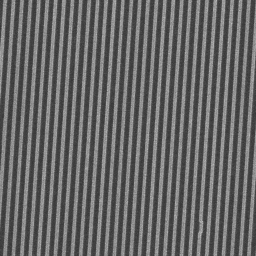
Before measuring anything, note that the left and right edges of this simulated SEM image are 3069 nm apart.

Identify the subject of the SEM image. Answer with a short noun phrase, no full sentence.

parallel lines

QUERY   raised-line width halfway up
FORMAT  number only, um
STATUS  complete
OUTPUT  0.0344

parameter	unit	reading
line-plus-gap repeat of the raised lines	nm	101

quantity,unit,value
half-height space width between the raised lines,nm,67.3